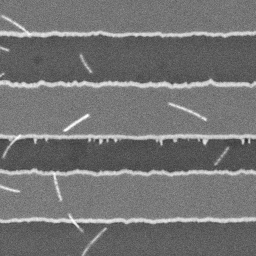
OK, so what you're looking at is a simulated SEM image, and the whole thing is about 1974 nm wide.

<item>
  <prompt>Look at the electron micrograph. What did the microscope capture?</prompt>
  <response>lines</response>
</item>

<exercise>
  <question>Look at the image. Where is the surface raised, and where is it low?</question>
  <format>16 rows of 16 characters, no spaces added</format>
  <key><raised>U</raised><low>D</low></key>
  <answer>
UUUUUUUUUUUUUUUU
UUUUUUUUUUUUUUUU
DDDDDDDDDDDDDDDD
DDDDDDDDDDDDDDDD
DDDDDDDDDDDDDDDD
UUUUUUUUUUUUUUUU
UUUUUUUUUUUUUUUU
UUUUUUUUUUUUUUUU
UUUUUUUUUUUUUUUU
DDDDDDDDDDDDDDDD
DDDDDDDDDDDDDDDD
UUUUUUUUUUUUUUUU
UUUUUUUUUUUUUUUU
UUUUUUUUUUUUUUUU
DDDDDDDDDDDDDDDD
DDDDDDDDDDDDDDDD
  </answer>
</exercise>